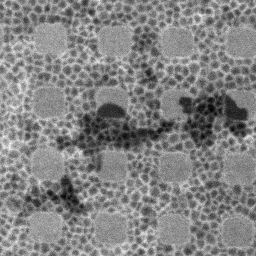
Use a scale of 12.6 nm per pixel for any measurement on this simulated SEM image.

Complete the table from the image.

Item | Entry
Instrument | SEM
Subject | a regular array of raised bodies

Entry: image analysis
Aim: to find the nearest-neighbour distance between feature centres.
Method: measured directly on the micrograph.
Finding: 787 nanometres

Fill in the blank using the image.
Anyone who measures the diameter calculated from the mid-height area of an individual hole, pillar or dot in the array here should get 426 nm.